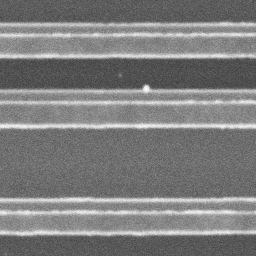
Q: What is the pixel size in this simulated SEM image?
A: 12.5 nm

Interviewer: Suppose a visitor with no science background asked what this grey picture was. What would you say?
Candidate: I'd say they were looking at lines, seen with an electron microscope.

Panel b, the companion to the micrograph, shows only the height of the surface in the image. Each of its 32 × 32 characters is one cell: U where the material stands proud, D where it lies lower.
DDDDDDDDDDDDDDDDDDDDDDDDDDDDDDDD
DDDDDDDDDDDDDDDDDDDDDDDDDDDDDDDD
DDDDDDDDDDDDDDDDDDDDDDDDDDDDDDDD
UUUUUUUUUUUUUUUUUUUUUUUUUUUUUUUU
UUUUUUUUUUUUUUUUUUUUUUUUUUUUUUUU
UUUUUUUUUUUUUUUUUUUUUUUUUUUUUUUU
UUUUUUUUUUUUUUUUUUUUUUUUUUUUUUUU
DDDDDDDDDDDDDDDDDDDDDDDDDDDDDDDD
DDDDDDDDDDDDDDDDDDDDDDDDDDDDDDDD
DDDDDDDDDDDDDDDDDDDDDDDDDDDDDDDD
DDDDDDDDDDDDDDDDDDDDDDDDDDDDDDDD
UUUUUUUUUUUUUUUUUUUUUUUUUUUUUUUU
UUUUUUUUUUUUUUUUUUUUUUUUUUUUUUUU
UUUUUUUUUUUUUUUUUUUUUUUUUUUUUUUU
UUUUUUUUUUUUUUUUUUUUUUUUUUUUUUUU
UUUUUUUUUUUUUUUUUUUUUUUUUUUUUUUU
DDDDDDDDDDDDDDDDDDDDDDDDDDDDDDDD
DDDDDDDDDDDDDDDDDDDDDDDDDDDDDDDD
DDDDDDDDDDDDDDDDDDDDDDDDDDDDDDDD
DDDDDDDDDDDDDDDDDDDDDDDDDDDDDDDD
DDDDDDDDDDDDDDDDDDDDDDDDDDDDDDDD
DDDDDDDDDDDDDDDDDDDDDDDDDDDDDDDD
DDDDDDDDDDDDDDDDDDDDDDDDDDDDDDDD
DDDDDDDDDDDDDDDDDDDDDDDDDDDDDDDD
DDDDDDDDDDDDDDDDDDDDDDDDDDDDDDDD
UUUUUUUUUUUUUUUUUUUUUUUUUUUUUUUU
UUUUUUUUUUUUUUUUUUUUUUUUUUUUUUUU
UUUUUUUUUUUUUUUUUUUUUUUUUUUUUUUU
UUUUUUUUUUUUUUUUUUUUUUUUUUUUUUUU
DDDDDDDDDDDDDDDDDDDDDDDDDDDDDDDD
DDDDDDDDDDDDDDDDDDDDDDDDDDDDDDDD
DDDDDDDDDDDDDDDDDDDDDDDDDDDDDDDD